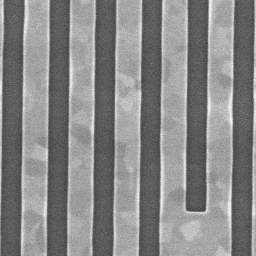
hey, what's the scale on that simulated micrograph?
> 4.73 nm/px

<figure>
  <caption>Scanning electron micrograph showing groups of lines, slits or small figures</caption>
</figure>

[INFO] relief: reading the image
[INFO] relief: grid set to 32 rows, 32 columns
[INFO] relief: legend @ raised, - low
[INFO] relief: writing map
---@@@---@@@---@@@--@@@---@@@---
---@@@---@@@---@@@--@@@---@@@---
---@@@---@@@---@@@--@@@---@@@---
---@@@---@@@---@@@--@@@---@@@---
---@@@---@@@---@@@--@@@---@@@---
---@@@---@@@---@@@--@@@---@@@---
---@@@---@@@--@@@@--@@@---@@@---
---@@@---@@@---@@@--@@@---@@@---
---@@@---@@@--@@@@--@@@---@@@---
---@@@---@@@--@@@@--@@@---@@@---
---@@@---@@@--@@@@--@@@---@@@---
---@@@---@@@--@@@@--@@@---@@@---
---@@@---@@@--@@@@--@@@---@@@---
---@@@---@@@--@@@@--@@@---@@@---
---@@@---@@@--@@@---@@@---@@@---
---@@@---@@@--@@@---@@@---@@@---
---@@@---@@@--@@@---@@@---@@@---
---@@@---@@@--@@@---@@@---@@@---
---@@@---@@@--@@@---@@@---@@@---
---@@@---@@@--@@@---@@@---@@@---
---@@@---@@@--@@@---@@@---@@@---
---@@@---@@@--@@@---@@@---@@@---
---@@@---@@@--@@@---@@@---@@@---
---@@@---@@@--@@@---@@@---@@@---
---@@@---@@@--@@@---@@@---@@@---
---@@@---@@@--@@@---@@@---@@@---
---@@@---@@@--@@@---@@@@@@@@@---
---@@@---@@@--@@@---@@@@@@@@@---
---@@@---@@@--@@@---@@@@@@@@@---
---@@@---@@@--@@@---@@@@@@@@@---
---@@@--@@@---@@@---@@@@@@@@@---
---@@@--@@@@--@@@---@@@@@@@@@---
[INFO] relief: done